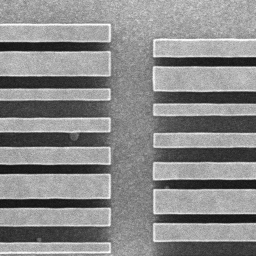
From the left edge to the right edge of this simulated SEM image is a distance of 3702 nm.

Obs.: groups of lines, slits or small figures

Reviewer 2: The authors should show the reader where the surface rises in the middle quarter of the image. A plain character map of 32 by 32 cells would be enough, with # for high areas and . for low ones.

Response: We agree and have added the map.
###########.....................
###########...........##########
###########...........##########
......................##########
......................##########
.......................#########
###########............#########
###########.....................
###########.....................
................................
.......................#########
.......................#########
.......................#########
................................
###########.....................
###########.....................
###########.....................
.......................#########
.......................#########
.......................#########
.......................#########
###########.....................
###########.....................
############....................
############....................
......................##########
......................##########
......................##########
###########...........##########
###########.....................
###########.....................
###########............#########